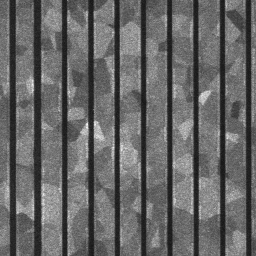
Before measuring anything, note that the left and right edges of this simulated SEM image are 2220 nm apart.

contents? parallel lines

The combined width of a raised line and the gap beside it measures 0.228 µm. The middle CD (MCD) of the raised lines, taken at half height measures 179 nm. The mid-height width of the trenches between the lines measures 6 pixels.